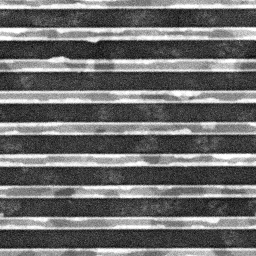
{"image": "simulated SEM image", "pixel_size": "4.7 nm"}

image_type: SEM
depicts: parallel lines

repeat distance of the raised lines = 148 nanometres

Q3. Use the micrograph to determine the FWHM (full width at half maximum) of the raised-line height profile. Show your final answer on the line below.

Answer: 0.0516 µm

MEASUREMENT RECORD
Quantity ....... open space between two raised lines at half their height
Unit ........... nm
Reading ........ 95.1